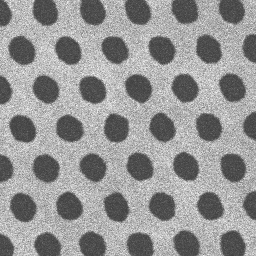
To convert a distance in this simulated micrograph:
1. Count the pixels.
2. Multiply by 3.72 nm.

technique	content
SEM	a regular array of holes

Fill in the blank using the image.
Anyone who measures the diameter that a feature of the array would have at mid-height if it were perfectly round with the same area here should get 0.101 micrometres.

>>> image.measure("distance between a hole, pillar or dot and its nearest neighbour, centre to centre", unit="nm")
167